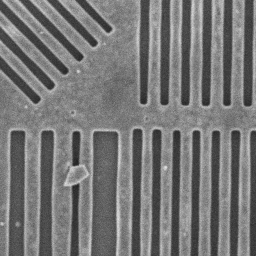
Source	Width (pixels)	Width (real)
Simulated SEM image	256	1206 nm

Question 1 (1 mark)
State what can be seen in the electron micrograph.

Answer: groups of lines, slits or small figures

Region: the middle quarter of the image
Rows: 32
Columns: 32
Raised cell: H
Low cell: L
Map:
HHHHHHHHHHHHHHHHHHHLLHHHLLLHHLLL
LHHHHHHHHHHHHHHHHHHLLHHHLLLHHLLL
LHHHHHHHHHHHHHHHHHHLLHHHLLLHHLLL
HHHHHHHHHHHHHHHHHHHLLHHHLLLHHLLL
HHHHHHHHHHHHHHHHHHHLLHHHLLHHHLLL
HHHHHHHHHHHHHHHHHHHLLHHHLLHHHLLL
HHHHHHHHHHHHHHHHHHHLLHHHLLHHHLLL
HHHHHHHHHHHHHHHHHHHLLHHHLLHHHLLL
HHHHHHHHHHHHHHHHHHHLLHHHLLHHHLLL
HHHHHHHHHHHHHHHHHHHLLHHHLLHHHLLH
HHHHHHHHHHHHHHHHHHHHHHHHHHHHHHHH
HHHHHHHHHHHHHHHHHHHHHHHHHHHHHHHH
HHHHHHHHHHHHHHHHHHHHHHHHHHHHHHHH
HHHHHHHHHHHHHHHHHHHHHHHHHHHHHHHH
HHHHHHHHHHHHHHHHHHHHHHHHHHHHHHHH
HHHHHHHHHHHHHHHHHHHHHHHHHHHHHHHH
HHHHHHHHHHHHHHHHHLLLHHLLHHHHHHHH
HHLLHHHLLLLLLLHHHLLLHHLLLHHLLHHH
HHLLHHHLLLLLLLHHHLLLHHLLLHHLLHHH
HHLLHHHLLLLLLLHHHLLLHHLLLHHLLHHH
HHLLHHHLLLLLLLHHHLLLHHLLLHHLLHHH
HHLLHHHLLLLLLLHHHLLLHHLLLHHLLHHH
HHLLHHHLLLLLLLHHHLLLHHLLLHHLLHHH
HHLLHHHLLLLLLLHHHLLLHHLLHHHLLHHH
HHLLHHHLLLLLLLHHHLLLHHLLHHHLLHHH
HHLHHHHLLLLLLLHHHLLLHHLLHHHLLHHH
HHHHHHHLLLLLLLHHHLLLHHLLHHHLLHHH
HHHHHHHLLLLLLLHHHLLLHHLLHHHLLHHH
HHHHHHHLLLLLLLHHHLLLHHLLHHHLLHHH
HHHHHHHLLLLLLLHHHLLLHHLLHHHLLHHH
HHLLHHHLLLLLLHHHHLLLHHLLHHHLLHHH
HHLLHHHLLLLLLHHHHLLLHHLLHHHLLHHH